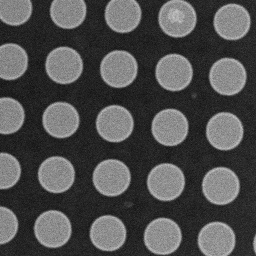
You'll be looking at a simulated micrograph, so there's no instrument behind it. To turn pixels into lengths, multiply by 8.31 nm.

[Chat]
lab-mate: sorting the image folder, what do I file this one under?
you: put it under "an array of small figures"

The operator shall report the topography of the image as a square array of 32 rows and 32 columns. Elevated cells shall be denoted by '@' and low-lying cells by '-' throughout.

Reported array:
@@@@--@@@@@---@@@----@@@--------
@@@@--@@@@@--@@@@@--@@@@---@@@@-
@@@----@@@---@@@@@--@@@@@--@@@@-
--------@-----@@@---@@@@---@@@@-
---------------------@@-----@@--
-@------------------------------
@@@---@@@@----@@----------------
@@@---@@@@---@@@@---@@@----@@---
@@@---@@@@---@@@@---@@@@--@@@@--
@@@---@@@@---@@@@---@@@@--@@@@@-
--------------@@----@@@@--@@@@@-
---------------------------@@@--
@@------------------------------
@@@---@@@----@@@----------------
@@@--@@@@@--@@@@---@@@@----@@---
@@@--@@@@@--@@@@@--@@@@---@@@@--
@@----@@@---@@@@---@@@@---@@@@--
-------------@@-----@@@---@@@@--
---------------------------@@---
@@------------------------------
@@---@@@@---@@@-----@-----------
@@@--@@@@---@@@@---@@@@---@@@---
@@---@@@@---@@@@--@@@@@--@@@@@--
@-----@@@---@@@@---@@@@--@@@@@--
-------------------@@@----@@@@--
---------------------------@----
@-----@@------------------------
@@---@@@@---@@@----@@-----------
@@--@@@@@--@@@@@--@@@@---@@@@---
@@--@@@@@--@@@@@--@@@@@--@@@@---
-----@@@----@@@---@@@@---@@@@---
-------------------@@@---@@@@---